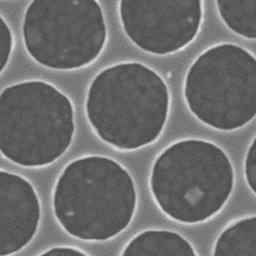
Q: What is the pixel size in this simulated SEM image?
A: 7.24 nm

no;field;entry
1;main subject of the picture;holes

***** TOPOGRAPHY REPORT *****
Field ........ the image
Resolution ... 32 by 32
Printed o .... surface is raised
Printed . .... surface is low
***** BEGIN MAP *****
oooo........ooo..........oo.....
ooo..........oo..........oo.....
ooo..........oo..........ooo....
.oo..........ooo.........oooo...
.oo..........ooo........oooooo..
.oo..........oooo......ooooooooo
.ooo.........oooooo..ooooo.....o
.ooo........ooooooooooooo.......
ooooooo..oooo.....oooooo........
oooooooooooo........ooo.........
oo....ooooo..........oo.........
.......oooo..........oo.........
.........oo..........oo.........
.........oo..........ooo........
.........oo..........oooo.......
.........oo.........oooooo.....o
.........ooo........oooooooooooo
.........oooo......ooooo.ooooooo
........ooooooo..oooo......oooo.
o......ooooooooooooo........ooo.
oo....ooo......oooo..........oo.
.ooooooo........ooo..........oo.
...oooo.........ooo..........oo.
....ooo..........oo..........oo.
.....oo..........oo..........ooo
.....oo..........ooo........oooo
.....oo..........oooo......ooooo
.....oo.........oooooo...ooooo..
.....ooo........oooooooooooo....
....ooooo.....ooo.....ooooo.....
...ooooooooooooo........ooo.....
..oooo....ooooo.........ooo.....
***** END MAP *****